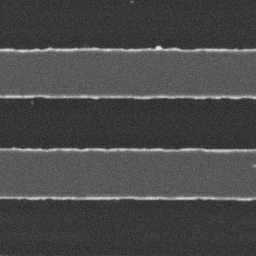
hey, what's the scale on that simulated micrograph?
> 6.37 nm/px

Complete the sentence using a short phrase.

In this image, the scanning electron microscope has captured lines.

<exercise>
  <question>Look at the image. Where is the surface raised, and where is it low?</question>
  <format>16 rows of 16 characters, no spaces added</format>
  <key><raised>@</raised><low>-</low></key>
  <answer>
----------------
----------------
----------------
@@@@@@@@@@@@@@@@
@@@@@@@@@@@@@@@@
@@@@@@@@@@@@@@@@
----------------
----------------
----------------
@@@@@@@@@@@@@@@@
@@@@@@@@@@@@@@@@
@@@@@@@@@@@@@@@@
----------------
----------------
----------------
----------------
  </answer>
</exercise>